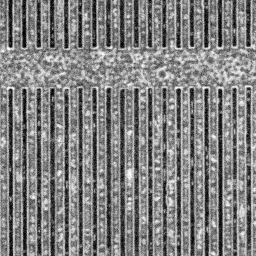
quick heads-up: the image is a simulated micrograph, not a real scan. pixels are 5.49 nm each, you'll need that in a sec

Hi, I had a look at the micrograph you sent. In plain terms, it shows parallel lines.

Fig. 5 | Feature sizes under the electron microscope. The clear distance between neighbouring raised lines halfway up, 5.01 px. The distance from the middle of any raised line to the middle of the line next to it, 76.9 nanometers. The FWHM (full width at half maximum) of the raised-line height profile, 48.7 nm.